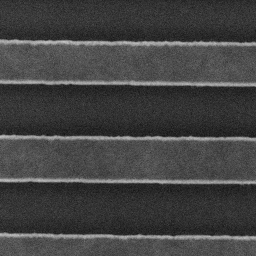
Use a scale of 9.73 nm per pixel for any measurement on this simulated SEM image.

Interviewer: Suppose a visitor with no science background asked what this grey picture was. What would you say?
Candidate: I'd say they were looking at lines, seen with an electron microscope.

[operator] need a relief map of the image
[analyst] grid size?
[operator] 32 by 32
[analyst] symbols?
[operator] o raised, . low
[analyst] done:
................................
................................
................................
................................
................................
oooooooooooooooooooooooooooooooo
oooooooooooooooooooooooooooooooo
oooooooooooooooooooooooooooooooo
oooooooooooooooooooooooooooooooo
oooooooooooooooooooooooooooooooo
......oo.ooooooooooooooooooooooo
................................
................................
................................
................................
................................
................................
oooooooooooooooooooooooooooooooo
oooooooooooooooooooooooooooooooo
oooooooooooooooooooooooooooooooo
oooooooooooooooooooooooooooooooo
oooooooooooooooooooooooooooooooo
oooooooooooooooooooooooooooooooo
................................
................................
................................
................................
................................
................................
oooooooooooooooooooooo.oooo.o...
oooooooooooooooooooooooooooooooo
oooooooooooooooooooooooooooooooo